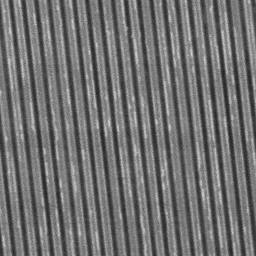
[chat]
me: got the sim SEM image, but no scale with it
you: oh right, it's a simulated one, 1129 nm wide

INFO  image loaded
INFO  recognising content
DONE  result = parallel lines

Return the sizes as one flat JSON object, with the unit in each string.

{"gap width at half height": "23.6 nanometers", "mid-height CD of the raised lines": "31.8 nanometers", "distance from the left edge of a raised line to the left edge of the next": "12.7 px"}